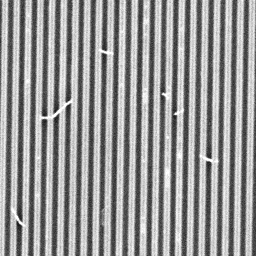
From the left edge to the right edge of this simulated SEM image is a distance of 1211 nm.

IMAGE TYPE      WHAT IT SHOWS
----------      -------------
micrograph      parallel lines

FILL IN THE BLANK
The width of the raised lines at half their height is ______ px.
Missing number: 5.01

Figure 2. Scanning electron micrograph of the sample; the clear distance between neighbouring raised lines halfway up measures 0.0325 um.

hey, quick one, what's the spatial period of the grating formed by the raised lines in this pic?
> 55.7 nanometres